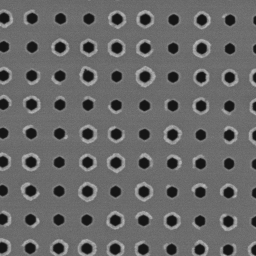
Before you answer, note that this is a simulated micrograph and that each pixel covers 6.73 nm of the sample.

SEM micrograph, a regular array of holes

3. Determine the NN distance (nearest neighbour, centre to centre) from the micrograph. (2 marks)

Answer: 28.2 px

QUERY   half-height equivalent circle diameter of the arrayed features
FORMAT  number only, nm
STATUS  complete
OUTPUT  71.2